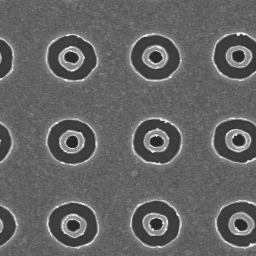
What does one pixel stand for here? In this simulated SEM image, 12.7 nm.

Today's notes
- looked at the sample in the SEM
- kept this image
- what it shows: ring-shaped grooves with a dot in the middle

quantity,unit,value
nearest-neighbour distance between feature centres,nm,1050